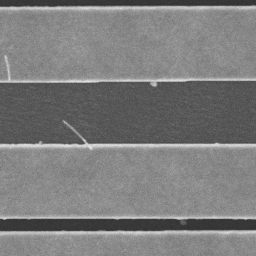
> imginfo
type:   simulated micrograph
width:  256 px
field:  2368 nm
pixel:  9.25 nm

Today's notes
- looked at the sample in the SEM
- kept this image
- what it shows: lines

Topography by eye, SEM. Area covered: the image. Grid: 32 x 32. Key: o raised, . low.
................................
oooooooooooooooooooooooooooooooo
oooooooooooooooooooooooooooooooo
oooooooooooooooooooooooooooooooo
oooooooooooooooooooooooooooooooo
oooooooooooooooooooooooooooooooo
oooooooooooooooooooooooooooooooo
oooooooooooooooooooooooooooooooo
oooooooooooooooooooooooooooooooo
oooooooooooooooooooooooooooooooo
................................
................................
................................
................................
................................
................................
................................
................................
oooooooooooooooooooooooooooooooo
oooooooooooooooooooooooooooooooo
oooooooooooooooooooooooooooooooo
oooooooooooooooooooooooooooooooo
oooooooooooooooooooooooooooooooo
oooooooooooooooooooooooooooooooo
oooooooooooooooooooooooooooooooo
oooooooooooooooooooooooooooooooo
oooooooooooooooooooooooooooooooo
................................
................................
oooooooooooooooooooooooooooooooo
oooooooooooooooooooooooooooooooo
oooooooooooooooooooooooooooooooo